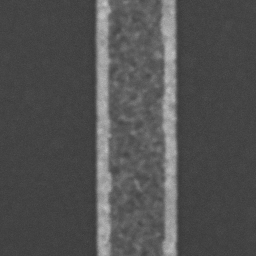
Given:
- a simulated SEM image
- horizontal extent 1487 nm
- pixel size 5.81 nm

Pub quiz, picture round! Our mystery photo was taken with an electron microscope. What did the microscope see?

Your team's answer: one or a few lines or trenches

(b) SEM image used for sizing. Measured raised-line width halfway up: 388 nanometers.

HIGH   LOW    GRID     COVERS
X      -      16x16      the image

------XXXXX-----
------XXXXX-----
------XXXXX-----
------XXXXX-----
------XXXXX-----
------XXXXX-----
------XXXXX-----
------XXXXX-----
------XXXXX-----
------XXXXX-----
------XXXXX-----
------XXXXX-----
------XXXXX-----
------XXXXX-----
------XXXXX-----
------XXXXX-----